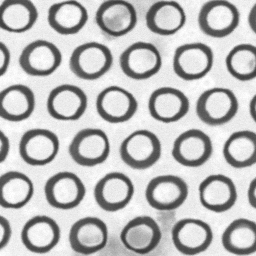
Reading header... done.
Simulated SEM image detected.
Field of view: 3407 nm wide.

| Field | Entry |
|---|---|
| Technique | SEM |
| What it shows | a regular array of ring-shaped grooves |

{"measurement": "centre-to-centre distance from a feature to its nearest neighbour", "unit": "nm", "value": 651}